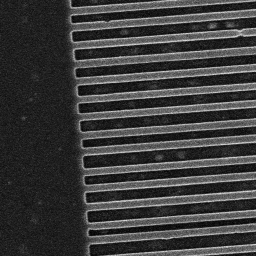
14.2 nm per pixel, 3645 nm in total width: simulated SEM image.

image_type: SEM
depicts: parallel lines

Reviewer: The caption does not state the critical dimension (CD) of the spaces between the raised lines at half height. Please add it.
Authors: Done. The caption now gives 0.161 um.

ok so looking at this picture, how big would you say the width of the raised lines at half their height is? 106 nm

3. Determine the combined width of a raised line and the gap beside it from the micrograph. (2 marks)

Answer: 0.253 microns